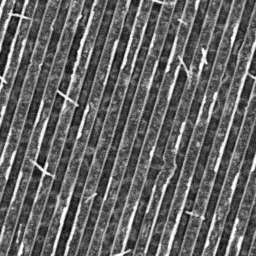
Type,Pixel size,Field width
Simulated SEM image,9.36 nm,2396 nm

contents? parallel lines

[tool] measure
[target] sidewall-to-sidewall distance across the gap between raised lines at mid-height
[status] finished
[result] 0.0985 um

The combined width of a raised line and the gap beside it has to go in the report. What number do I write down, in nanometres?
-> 206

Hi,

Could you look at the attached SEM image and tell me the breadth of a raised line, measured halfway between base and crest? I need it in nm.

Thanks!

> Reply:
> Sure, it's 115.